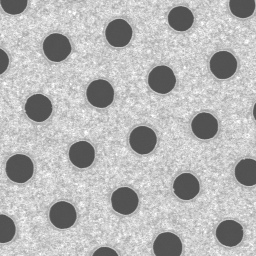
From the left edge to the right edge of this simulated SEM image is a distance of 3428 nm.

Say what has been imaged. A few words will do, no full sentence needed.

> a regular array of holes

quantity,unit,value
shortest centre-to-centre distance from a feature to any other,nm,845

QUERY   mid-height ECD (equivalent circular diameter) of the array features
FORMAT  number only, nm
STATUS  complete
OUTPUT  373